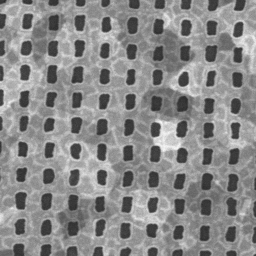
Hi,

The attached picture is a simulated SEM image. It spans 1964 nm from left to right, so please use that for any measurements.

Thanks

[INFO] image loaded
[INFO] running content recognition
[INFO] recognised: a regular array of holes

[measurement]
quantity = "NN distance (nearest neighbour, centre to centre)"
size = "192 nm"